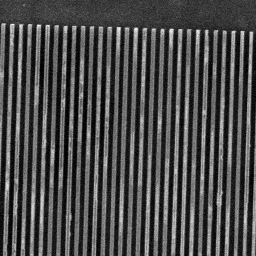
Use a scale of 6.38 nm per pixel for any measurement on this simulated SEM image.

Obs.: parallel lines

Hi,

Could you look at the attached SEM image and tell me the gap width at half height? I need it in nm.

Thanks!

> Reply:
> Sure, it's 31.9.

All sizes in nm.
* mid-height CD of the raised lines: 24.7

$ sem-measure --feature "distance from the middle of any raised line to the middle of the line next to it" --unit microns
0.0565